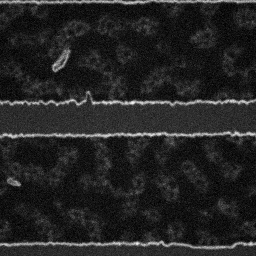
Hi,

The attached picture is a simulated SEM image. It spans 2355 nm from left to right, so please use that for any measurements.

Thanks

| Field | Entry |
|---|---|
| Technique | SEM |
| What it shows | one or a few lines or trenches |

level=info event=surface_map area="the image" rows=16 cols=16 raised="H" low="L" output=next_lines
HHHHHHHHHHHHHHHH
HHHHHHHHHHHHHHHH
HHHHHHHHHHHHHHHH
HHHHHHHHHHHHHHHH
HHHHHHHHHHHHHHHH
HHHHHHHHHHHHHHHH
LLLLLLLLLLLLLLLL
LLLLLLLLLLLLLLLL
HHHHHHHHHHHHHHHH
HHHHHHHHHHHHHHHH
HHHHHHHHHHHHHHHH
HHHHHHHHHHHHHHHH
HHHHHHHHHHHHHHHH
HHHHHHHHHHHHHHHH
HHHHHHHHHHHHHHHH
LLLLLLLLLLLLLLLL